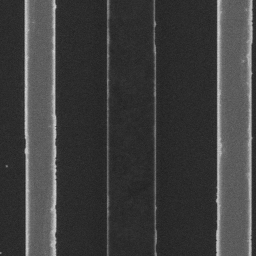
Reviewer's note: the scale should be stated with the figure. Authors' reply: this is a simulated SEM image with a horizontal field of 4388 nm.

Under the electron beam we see lines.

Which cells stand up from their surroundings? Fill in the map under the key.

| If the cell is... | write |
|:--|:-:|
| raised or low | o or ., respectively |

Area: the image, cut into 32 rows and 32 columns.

...oooo......oooooo........oooo.
...oooo......oooooo........oooo.
...oooo......oooooo........oooo.
...oooo......oooooo........oooo.
...oooo......oooooo........oooo.
...oooo......oooooo........oooo.
...oooo......oooooo........oooo.
...oooo......oooooo........oooo.
...oooo......oooooo........oooo.
...oooo......oooooo........oooo.
...oooo......oooooo........oooo.
...oooo......oooooo........oooo.
...oooo......oooooo........oooo.
...oooo......oooooo........oooo.
...oooo......oooooo........oooo.
...oooo......oooooo........oooo.
...oooo......oooooo........oooo.
...oooo......oooooo........oooo.
...oooo......oooooo........oooo.
...oooo......oooooo........oooo.
...oooo......oooooo........oooo.
...oooo......oooooo........oooo.
...oooo......oooooo........oooo.
...oooo......oooooo........oooo.
...oooo......oooooo........oooo.
...oooo......oooooo........oooo.
...oooo......ooooooo.......oooo.
...oooo......oooooo........oooo.
...oooo......ooooooo.......oooo.
...oooo......ooooooo.......oooo.
...oooo......ooooooo.......oooo.
...oooo......ooooooo.......oooo.